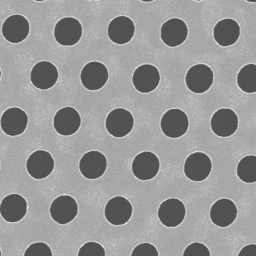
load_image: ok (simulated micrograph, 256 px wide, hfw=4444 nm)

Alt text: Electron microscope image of a regular array of holes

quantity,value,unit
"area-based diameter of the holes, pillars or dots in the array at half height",0.487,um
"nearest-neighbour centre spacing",877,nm